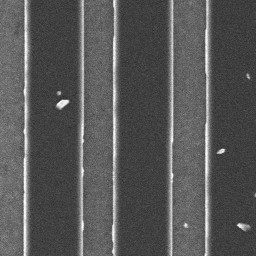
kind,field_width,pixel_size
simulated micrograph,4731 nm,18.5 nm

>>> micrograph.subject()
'lines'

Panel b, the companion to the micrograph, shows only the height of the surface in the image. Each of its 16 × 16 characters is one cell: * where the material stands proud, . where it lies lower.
..***..****..***
..***..****..***
..***..****..***
..***..****..***
..***..****..***
..***..****..***
..***..****..***
..***..****..***
..***..****..***
..***..****..***
..***..****..***
..***..****..***
..***..****..***
..***..****..***
..***..****..***
..***..****..***